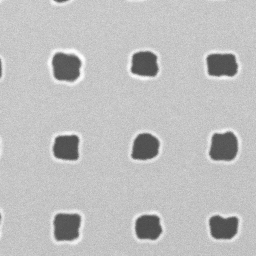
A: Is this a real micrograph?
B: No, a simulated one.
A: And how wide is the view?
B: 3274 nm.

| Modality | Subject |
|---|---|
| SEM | a regular array of holes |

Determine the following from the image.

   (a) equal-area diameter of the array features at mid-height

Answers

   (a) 0.37 micrometres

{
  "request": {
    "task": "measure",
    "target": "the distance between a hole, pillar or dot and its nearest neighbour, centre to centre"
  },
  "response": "1 microns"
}